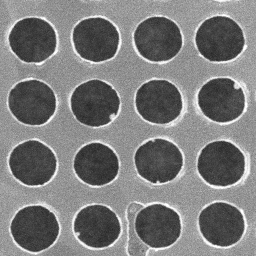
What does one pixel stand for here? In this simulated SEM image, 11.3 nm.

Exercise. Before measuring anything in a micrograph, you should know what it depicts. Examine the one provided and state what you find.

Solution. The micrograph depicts a regular array of holes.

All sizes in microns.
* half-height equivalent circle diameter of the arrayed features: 0.528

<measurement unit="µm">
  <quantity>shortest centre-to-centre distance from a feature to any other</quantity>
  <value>0.688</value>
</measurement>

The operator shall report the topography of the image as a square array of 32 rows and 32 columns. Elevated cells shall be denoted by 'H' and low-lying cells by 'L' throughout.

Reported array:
HHHHHHHHHHHHHHHHHHHHHHHHHHHHHHHH
HHHHHHHHHHHHHHHHHHHHHHHHHHHHHHHH
HHHLLHHHHHHLLLHHHHLLLHHHHHLLLHHH
HHLLLLLHHLLLLLHHHLLLLLHHHLLLLLHH
HLLLLLLHHLLLLLLHHLLLLLLHLLLLLLLH
HLLLLLLHHLLLLLLHHLLLLLLHHLLLLLLH
HHLLLLLHHHLLLLLHHLLLLLHHHLLLLLHH
HHHLLLHHHHHLLHHHHHHLLHHHHHLLLHHH
HHHHHHHHHHHHHHHHHHHHHHHHHHHHHHHH
HHHHHHHHHHHHHHHHHHHHHHHHHHHHHHHH
HHLLLLHHHHLLLHHHHHLLLLHHHHLLLLHH
HLLLLLLHHLLLLLLHHLLLLLHHHLLLLLHH
HLLLLLLHHLLLLLLHHLLLLLLHHLLLLLLH
HLLLLLLHHLLLLLLHHLLLLLLHHLLLLLLH
HHLLLLLHHLLLLLHHHHLLLLHHHHLLLLHH
HHHLLHHHHHLLLHHHHHHLLHHHHHHHHHHH
HHHHHHHHHHHHHHHHHHHHHHHHHHHHHHHH
HHHHHHHHHHHHHHHHHHHLLHHHHHHLHHHH
HHLLLLHHHHLLLLHHHLLLLLHHHLLLLLHH
HLLLLLLHHLLLLLLHHLLLLLLHHLLLLLLH
HLLLLLLHHLLLLLLHHLLLLLLHHLLLLLLH
HLLLLLLHHLLLLLLHHLLLLLHHHLLLLLLH
HHLLLLHHHHLLLLHHHHLLLHHHHHLLLLHH
HHHHHHHHHHHHHHHHHHHHHHHHHHHHHHHH
HHHHHHHHHHHHHHHHHHHHHHHHHHHHHHHH
HHHHHHHHHHHHHHHHLLHLHHHHHHLLLHHH
HHLLLLHHHHLLLLHHLLLLLLHHHLLLLLHH
HHLLLLLHHLLLLLLHLLLLLLLHHLLLLLLH
HLLLLLLHHLLLLLLHLLLLLLLHHLLLLLLH
HHLLLLLHHLLLLLLHLLLLLLHHHLLLLLHH
HHLLLLLHHHLLLLHHLLLLLLHHHHHLLHHH
HHHHLHHHHHHHHHHHLLHHHHHHHHHHHHHH